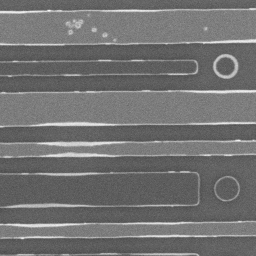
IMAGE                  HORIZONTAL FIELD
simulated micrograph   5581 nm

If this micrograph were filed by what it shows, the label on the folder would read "groups of lines, slits or small figures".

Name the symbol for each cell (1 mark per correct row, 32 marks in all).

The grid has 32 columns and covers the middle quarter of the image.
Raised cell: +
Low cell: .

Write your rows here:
++++++++++++++++++++++++++++++++
++++++++++++++++++++++++++++++++
+++++++++++.....................
................................
................................
................................
................................
++++++++++++++++++++++++++++++++
++++++++++++++++++++++++++++++++
++++++++++++++++++++++++++++++++
++++++++++++++++++++++++++++++++
++++++++++++++++++++++++++++++++
++++++++++++++++++++++++++++++++
++++++++++++++++++++++++++++++++
++++++++++++++++++++++++++++++++
................................
................................
................................
................................
..............................++
++++++++++++++++++++++++++++++++
++++++++++++++++++++++++++++++++
++++++++++++++++++++++++++++++++
................................
................................
................................
................................
.........+++++++++++++++++++++++
++++++++++++++++++++++++++++++++
++++++++++++++++++++++++++++++++
++++++++++++++++++++++++++++++++
++++++++++++++++++++++++++++++++